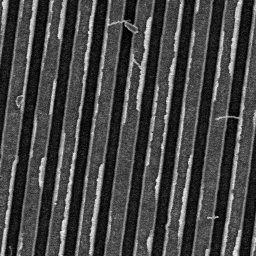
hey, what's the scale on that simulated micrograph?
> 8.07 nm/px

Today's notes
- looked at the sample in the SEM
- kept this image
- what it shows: parallel lines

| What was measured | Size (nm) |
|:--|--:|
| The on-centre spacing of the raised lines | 234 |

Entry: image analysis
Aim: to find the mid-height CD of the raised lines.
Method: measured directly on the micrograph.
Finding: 138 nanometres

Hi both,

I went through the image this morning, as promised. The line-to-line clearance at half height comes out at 102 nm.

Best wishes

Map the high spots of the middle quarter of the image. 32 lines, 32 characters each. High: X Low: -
--XXXX---XXXX---XXXX----XXXX---X
--XXXX---XXXX---XXXX---XXXXX---X
--XXX----XXXX---XXXX---XXXX----X
-XXXX----XXXX---XXXX---XXXX----X
-XXXX----XXXX---XXXX---XXXX----X
-XXXX---XXXXX---XXXX---XXXX---XX
-XXXX---XXXX----XXX----XXXX---XX
-XXXX---XXXX---XXXX----XXXX---XX
-XXXX---XXXX---XXXX----XXXX---XX
-XXXX---XXXX---XXXX---XXXX----XX
XXXXX---XXXX---XXXX---XXXX----XX
XXXX----XXXX---XXXX---XXXX----XX
XXXX---XXXX----XXXX---XXXX---XXX
XXXX---XXXXX---XXXX---XXXX---XXX
XXXX---XXXX---XXXX----XXXX---XXX
XXXX---XXXX---XXXX----XXXX---XXX
XXXX---XXXX---XXXX----XXXX---XXX
XXX----XXXX---XXXX---XXXX----XXX
XXX----XXXX---XXXX---XXXX----XXX
XXX----XXXX---XXXX---XXXX---XXXX
XXX---XXXXX---XXXX---XXXX---XXXX
XXX---XXXX----XXXX---XXXX---XXXX
XXX---XXXX---XXXX----XXXX---XXXX
XXX---XXXX---XXXX----XXXX---XXXX
XXX---XXXX---XXXX---XXXXX---XXXX
XX----XXXX---XXXX---XXXX----XXXX
XX----XXXX---XXXX---XXXX----XXXX
XX----XXXX---XXXX---XXXX----XXXX
XX---XXXXX---XXXX---XXXX---XXXX-
XX---XXXX----XXX----XXXX---XXXX-
XX---XXXX---XXXXX---XXXX---XXXX-
XX---XXXX---XXXX----XXX----XXXX-